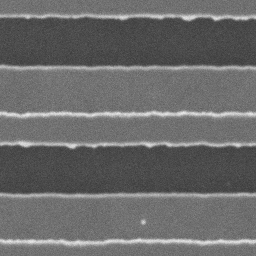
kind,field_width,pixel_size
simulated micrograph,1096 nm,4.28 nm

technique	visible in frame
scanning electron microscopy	lines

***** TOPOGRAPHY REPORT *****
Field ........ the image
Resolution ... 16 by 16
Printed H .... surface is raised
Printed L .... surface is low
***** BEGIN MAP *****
HHHHHHHHHHHHHHHH
LLLLLLLLLLLLLLLL
LLLLLLLLLLLLLLLL
LLLLLLLLLLLLLLLL
HHHHHHHHHHHHHHHH
HHHHHHHHHHHHHHHH
HHHHHHHHHHHHHHHH
HHHHHHHHHHHHHHHH
HHHHHHHHHHHHHHHH
LLLLLLLLLLLLLLLL
LLLLLLLLLLLLLLLL
LLLLLLLLLLLLLLLL
HHHHHHHHHHHHHHHH
HHHHHHHHHHHHHHHH
HHHHHHHHHHHHHHHH
HHHHHHHHHHHHHHHH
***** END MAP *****